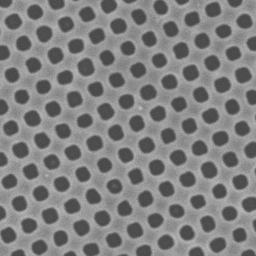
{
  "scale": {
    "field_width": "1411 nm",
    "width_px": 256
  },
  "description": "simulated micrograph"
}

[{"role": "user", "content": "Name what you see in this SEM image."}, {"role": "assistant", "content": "a regular array of holes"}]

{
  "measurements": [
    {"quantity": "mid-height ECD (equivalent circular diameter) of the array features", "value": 0.088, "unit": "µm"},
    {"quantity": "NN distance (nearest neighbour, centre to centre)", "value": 23.1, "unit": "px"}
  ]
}